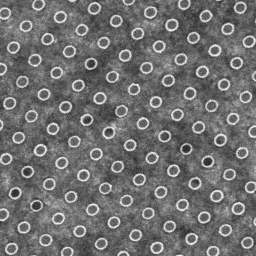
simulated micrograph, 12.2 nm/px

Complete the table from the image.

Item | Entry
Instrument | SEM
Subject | a regular array of raised bodies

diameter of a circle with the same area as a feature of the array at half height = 137 nm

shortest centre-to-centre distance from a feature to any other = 0.303 um